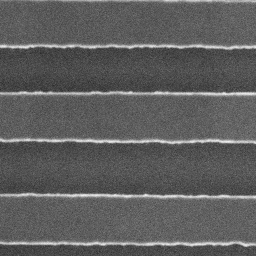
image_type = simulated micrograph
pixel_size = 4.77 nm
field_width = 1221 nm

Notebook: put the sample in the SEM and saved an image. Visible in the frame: lines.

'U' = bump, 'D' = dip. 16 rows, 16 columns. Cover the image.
UUUUUUUUUUUUUUUU
UUUUUUUUUUUUUUUU
UUUUUUUUUUUUUUUU
DDDDDDDDDDDDDDDD
DDDDDDDDDDDDDDDD
DDDDDDDDDDDDDDDD
UUUUUUUUUUUUUUUU
UUUUUUUUUUUUUUUU
UUUUUUUUUUUUUUUU
DDDDDDDDDDDDDDDD
DDDDDDDDDDDDDDDD
DDDDDDDDDDDDDDDD
UUUUUUUUUUUUUUUU
UUUUUUUUUUUUUUUU
UUUUUUUUUUUUUUUU
DDDDDDDDDDDDDDDD